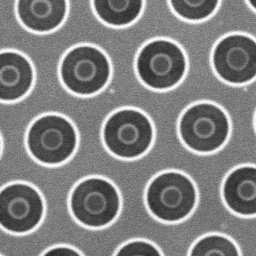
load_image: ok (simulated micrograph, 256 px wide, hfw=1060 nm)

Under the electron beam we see an array of small figures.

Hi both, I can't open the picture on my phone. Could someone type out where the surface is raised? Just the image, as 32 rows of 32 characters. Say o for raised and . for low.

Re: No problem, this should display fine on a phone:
oo......oooo......ooo......oooo.
oo......oooo......oooo.....ooooo
ooo.....ooooo....ooooooo.ooooooo
ooo....ooooooooooooooooooooooooo
oooooooooooooooooooooooooooo...o
oooooooooooooooooo....ooooo.....
..ooooooo....oooo......oooo.....
...ooooo......ooo......oooo.....
....oooo......ooo......oooo.....
....oooo......ooo......oooo.....
....oooo.....ooooo....ooooooo.oo
...oooooo...oooooooooooooooooooo
..oooooooooooooooooooooooooooooo
oooooooooooooooooooooooo....oooo
ooooo...oooooo....ooooo.....oooo
oooo.....oooo......ooo.......ooo
oooo.....oooo......ooo.......ooo
ooo.......ooo......oooo.....oooo
ooo......oooo......ooooo...ooooo
oooo.....oooooo..ooooooooooooooo
oooooo.ooooooooooooooooooooooooo
ooooooooooooooooooooo.ooooooo...
ooooooooooo..oooooo.....oooo....
o...ooooo.....oooo......oooo....
.....oooo......ooo.......ooo....
.....oooo......ooo......oooo....
.....oooo......oooo.....ooooo...
.....ooooo....oooooo...ooooooooo
o...oooooooooooooooooooooooooooo
oooooooooooooooooooooooooo..oooo
oooooooooooooooo...ooooo.....ooo
oooooo....ooooo.....oooo......oo